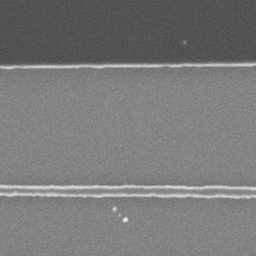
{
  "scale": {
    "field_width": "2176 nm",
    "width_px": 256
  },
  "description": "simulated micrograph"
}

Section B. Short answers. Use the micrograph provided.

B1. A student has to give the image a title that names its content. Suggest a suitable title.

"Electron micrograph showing lines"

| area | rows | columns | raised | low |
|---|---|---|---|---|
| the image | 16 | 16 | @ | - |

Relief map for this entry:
@@@@@@@@@@@@@@@@
@@@@@@@@@@@@@@@@
@@@@@@@@@@@@@@@@
@@@@@@@@@@@@@@@@
----------------
----------------
----------------
----------------
----------------
----------------
----------------
----------------
----------------
----------------
----------------
----------------